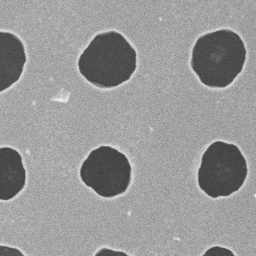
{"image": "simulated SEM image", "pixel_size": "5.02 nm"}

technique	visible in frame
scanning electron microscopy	holes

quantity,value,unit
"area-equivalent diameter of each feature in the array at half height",269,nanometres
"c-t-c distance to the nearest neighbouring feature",111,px